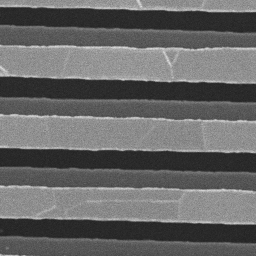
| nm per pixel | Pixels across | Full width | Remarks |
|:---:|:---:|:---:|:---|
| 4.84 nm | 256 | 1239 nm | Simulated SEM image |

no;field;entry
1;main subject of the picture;lines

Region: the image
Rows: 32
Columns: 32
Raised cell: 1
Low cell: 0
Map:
11111111111111111111111111111111
00000000000000000000000000000000
00000000000000000000000000000000
11111111110000000000000000000000
11111111111111111111111111111111
11111111111111111111111111111111
11111111111111111111111111111111
11111111111111111111111111111111
11111111111111111111111111111111
11111111111111111111111111111111
00000000000000000000000000000000
00000000000000000000000000000000
11111111111111111111000000000000
11111111111111111111111111111111
11111111111111111111111111111111
11111111111111111111111111111111
11111111111111111111111111111111
11111111111111111111111111111111
00111111111111111111111111111111
00000000000000000000000000000000
00000000000000000000000000000000
11111111111111111111111110000000
11111111111111111111111111111111
11111111111111111111111111111111
11111111111111111111111111111111
11111111111111111111111111111111
11111111111111111111111111111111
00000000000000001111111111111111
00000000000000000000000000000000
00000000000000000000000000000000
11111111111111111111111111111111
11111111111111111111111111111111